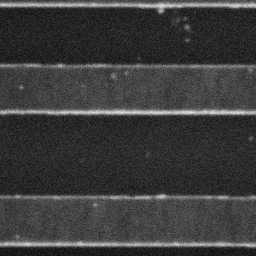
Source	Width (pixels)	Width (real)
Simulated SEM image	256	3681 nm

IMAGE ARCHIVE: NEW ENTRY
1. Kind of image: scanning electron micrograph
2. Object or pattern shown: lines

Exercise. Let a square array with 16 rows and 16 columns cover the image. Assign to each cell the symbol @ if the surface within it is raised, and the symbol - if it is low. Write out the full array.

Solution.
----------------
----------------
----------------
----------------
@@@@@@@@@@@@@@@@
@@@@@@@@@@@@@@@@
@@@@@@@@@@@@@@@@
----------------
----------------
----------------
----------------
----------------
@@@@@@@@@@@@@@@@
@@@@@@@@@@@@@@@@
@@@@@@@@@@@@@@@@
----------------